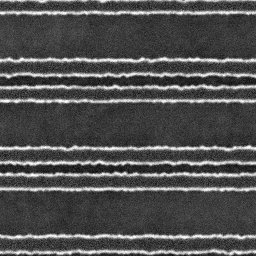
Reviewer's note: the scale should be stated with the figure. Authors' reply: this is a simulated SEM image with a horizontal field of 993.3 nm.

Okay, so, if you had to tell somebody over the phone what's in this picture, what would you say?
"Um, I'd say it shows lines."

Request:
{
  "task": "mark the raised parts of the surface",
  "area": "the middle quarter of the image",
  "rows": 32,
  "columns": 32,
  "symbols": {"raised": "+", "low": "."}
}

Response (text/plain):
++++++++++++++++++++++++++++++++
++++++++++++++++++++++++++++++++
++++++++++++++++++++++++++++++++
................................
................................
................................
++++++++++++++++++++++++++++++++
++++++++++++++++++++++++++++++++
++++++++++++++++++++++++++++++++
................................
................................
................................
................................
................................
................................
................................
................................
................................
................................
................................
................................
++++++++++++++++++++++++++++++++
++++++++++++++++++++++++++++++++
++++++++++++++++++++++++++++++++
++++++++++++++++++++++++++++++++
................................
................................
.+...+...++.++++.++......+.+++++
++++++++++++++++++++++++++++++++
++++++++++++++++++++++++++++++++
++++++++++++++++++++++++++++++++
++.++..........++.............+.